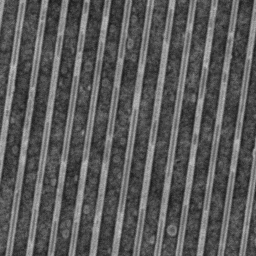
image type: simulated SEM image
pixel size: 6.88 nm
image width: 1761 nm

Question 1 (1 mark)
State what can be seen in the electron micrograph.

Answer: parallel lines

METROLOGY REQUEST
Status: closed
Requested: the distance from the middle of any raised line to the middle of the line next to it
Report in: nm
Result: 145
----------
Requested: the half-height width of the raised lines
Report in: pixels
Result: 4.35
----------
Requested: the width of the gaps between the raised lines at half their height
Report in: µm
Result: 0.114